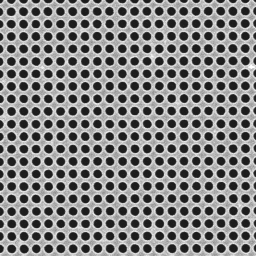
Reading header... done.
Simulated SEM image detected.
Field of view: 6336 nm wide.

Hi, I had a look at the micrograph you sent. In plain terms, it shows a regular array of holes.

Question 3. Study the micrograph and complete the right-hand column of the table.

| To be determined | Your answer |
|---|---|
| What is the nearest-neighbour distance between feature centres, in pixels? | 12.1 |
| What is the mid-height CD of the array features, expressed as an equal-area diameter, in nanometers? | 223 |